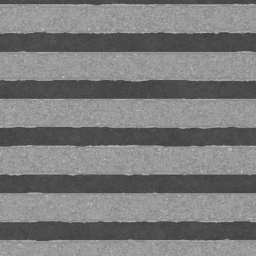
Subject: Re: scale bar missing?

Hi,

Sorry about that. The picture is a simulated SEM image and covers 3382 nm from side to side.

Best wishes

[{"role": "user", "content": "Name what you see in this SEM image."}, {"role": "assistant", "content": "lines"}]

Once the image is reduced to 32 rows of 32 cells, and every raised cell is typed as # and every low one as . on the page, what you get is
................................
################################
################################
################################
................................
................................
..##.........................###
################################
################################
################################
................................
................................
################################
################################
################################
################################
................................
................................
################################
################################
################################
################################
................................
................................
################################
################################
################################
################################
................................
................................
################################
################################